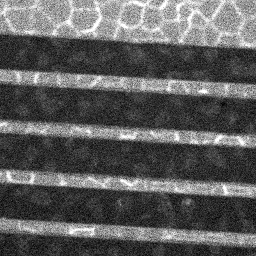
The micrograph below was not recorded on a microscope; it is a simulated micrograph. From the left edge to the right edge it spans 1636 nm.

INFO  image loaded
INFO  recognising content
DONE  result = parallel lines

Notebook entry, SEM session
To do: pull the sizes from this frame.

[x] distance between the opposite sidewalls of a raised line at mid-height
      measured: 237 nanometres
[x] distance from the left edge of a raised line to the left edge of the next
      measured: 317 nanometers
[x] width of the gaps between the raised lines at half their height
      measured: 75.7 nanometers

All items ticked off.